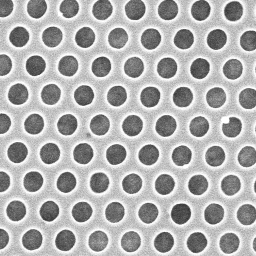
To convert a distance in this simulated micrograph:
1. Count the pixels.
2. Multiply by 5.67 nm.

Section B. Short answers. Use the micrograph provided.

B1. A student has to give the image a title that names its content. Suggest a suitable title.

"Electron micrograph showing a regular array of holes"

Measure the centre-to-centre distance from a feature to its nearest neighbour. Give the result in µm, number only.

0.185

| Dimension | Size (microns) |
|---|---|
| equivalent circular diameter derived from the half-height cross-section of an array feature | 0.118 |